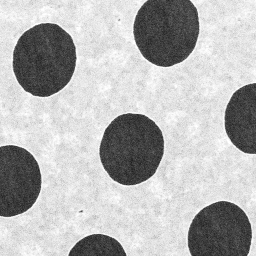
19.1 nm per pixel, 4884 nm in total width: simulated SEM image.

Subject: holes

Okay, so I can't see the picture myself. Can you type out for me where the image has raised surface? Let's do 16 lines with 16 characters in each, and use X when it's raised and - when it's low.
XXXXXXXXX---XXXX
XX-XXXXX----XXXX
X----XXX----XXXX
X----XXXX---XXXX
X----XXXXXXXXXXX
X---XXXXXXXXXXX-
XXXXXXXXXXXXXX--
XXXXXXX---XXXX--
XXXXXX----XXXX--
--XXXX----XXXXX-
--XXXX----XXXXXX
---XXXXX-XXXXXXX
--XXXXXXXXXXXXXX
-XXXXXXXXXXX---X
XXXXXXXXXXXX----
XXXXX---XXXX----